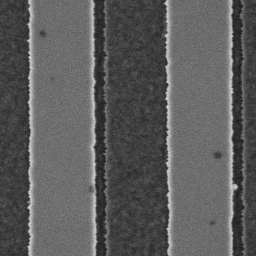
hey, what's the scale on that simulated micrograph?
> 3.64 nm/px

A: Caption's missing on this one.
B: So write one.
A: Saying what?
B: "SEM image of lines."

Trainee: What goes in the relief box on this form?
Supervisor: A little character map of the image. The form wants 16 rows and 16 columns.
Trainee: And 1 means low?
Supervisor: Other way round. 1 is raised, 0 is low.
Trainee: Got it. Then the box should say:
0011110000111100
0011110000111100
0011110000111110
0011110000111100
0011110000111110
0011110000111100
0011110000111100
0011110000111110
0011110000111110
0011110000111110
0011110000111110
0011110000011110
0011110000011110
0011110000011110
0011110000011110
0011110000011110